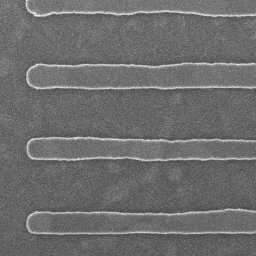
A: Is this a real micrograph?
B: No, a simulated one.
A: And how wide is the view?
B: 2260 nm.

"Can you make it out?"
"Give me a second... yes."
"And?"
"one or a few lines or trenches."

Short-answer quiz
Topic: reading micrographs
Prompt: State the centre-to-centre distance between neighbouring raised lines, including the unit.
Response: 646 nm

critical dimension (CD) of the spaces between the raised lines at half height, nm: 460